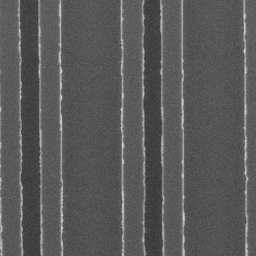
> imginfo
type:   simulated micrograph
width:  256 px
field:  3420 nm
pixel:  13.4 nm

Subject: lines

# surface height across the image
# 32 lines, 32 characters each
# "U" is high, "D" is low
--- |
UUDDDUUUDDDDDDDUUUDDUUUDDDDDDDDU
UUDDDUUUDDDDDDDUUUDDUUUDDDDDDDDU
UUDDDUUUDDDDDDDUUUDDUUUDDDDDDDDU
UUDDDUUUDDDDDDDUUUDDUUUDDDDDDDDU
UUDDDUUUDDDDDDDUUUDDUUUDDDDDDDDU
UUDDDUUUDDDDDDDUUUDDUUUDDDDDDDDU
UUDDDUUUDDDDDDDUUUDDUUUDDDDDDDDU
UUUDDUUUDDDDDDDUUUDDUUUDDDDDDDDU
UUDDDUUUDDDDDDDUUUDDUUUDDDDDDDDU
UUDDDUUUDDDDDDDUUUDDUUUDDDDDDDDU
UUUDDUUUDDDDDDDUUUDDUUUDDDDDDDDU
UUUDDUUUDDDDDDDUUUDDUUUDDDDDDDDU
UUUDDUUUDDDDDDDUUUDDUUUDDDDDDDDU
UUDDDUUUDDDDDDDUUUDDUUUDDDDDDDDU
UUDDDUUUDDDDDDDUUUDDUUUDDDDDDDDU
UUUDDUUUDDDDDDDUUUDDUUUDDDDDDDDU
UUUDDUUUDDDDDDDUUUDDUUUDDDDDDDDU
UUUDDUUUDDDDDDDUUUDDUUUDDDDDDDDU
UUUDDUUUDDDDDDDUUUDDUUUDDDDDDDDU
UUUDDUUUDDDDDDDUUUDDUUUDDDDDDDDU
UUUDDUUUDDDDDDDUUUDDUUUDDDDDDDDU
UUUDDUUUDDDDDDDUUUDDUUUDDDDDDDDU
UUUDDUUUDDDDDDDUUUDDUUUDDDDDDDDU
UUUDDUUUDDDDDDDUUUDDUUUDDDDDDDDU
UUUDDUUUDDDDDDDUUUDDUUUDDDDDDDDU
UUUDDUUUDDDDDDDUUUDDUUUDDDDDDDDU
UUUDDUUUDDDDDDDUUUDDUUUDDDDDDDDU
UUUDDUUUDDDDDDDUUUDDUUUDDDDDDDDU
UUUDDUUUDDDDDDDUUUDDUUUDDDDDDDDU
UUUDDUUUDDDDDDDUUUDDUUUDDDDDDDDU
UUUDDUUUDDDDDDDUUUDDUUUDDDDDDDDU
UUUDDUUUDDDDDDDUUUDDUUUDDDDDDDDU